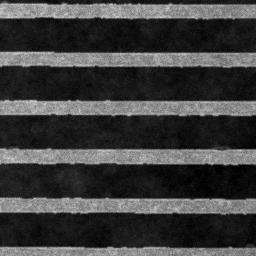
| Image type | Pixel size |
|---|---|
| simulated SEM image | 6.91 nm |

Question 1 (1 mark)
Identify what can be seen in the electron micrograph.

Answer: lines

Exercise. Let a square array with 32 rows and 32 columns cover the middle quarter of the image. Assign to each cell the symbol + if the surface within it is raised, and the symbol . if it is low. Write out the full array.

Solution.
++.+++++..++++++++++++++++++++++
................................
................................
................................
................................
................................
................................
................................
................................
++++++++++++++++++++++++++++++++
++++++++++++++++++++++++++++++++
++++++++++++++++++++++++++++++++
+.++++++++++++++++++++++++++++++
................................
................................
................................
................................
................................
................................
................................
................................
................................
++++++++++++++++++++++++++++++++
++++++++++++++++++++++++++++++++
++++++++++++++++++++++++++++++++
................................
................................
................................
................................
................................
................................
................................